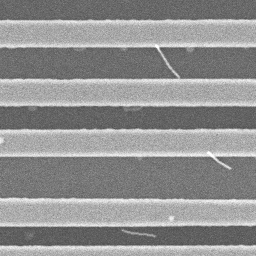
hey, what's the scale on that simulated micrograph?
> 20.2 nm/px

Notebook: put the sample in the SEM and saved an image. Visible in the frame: lines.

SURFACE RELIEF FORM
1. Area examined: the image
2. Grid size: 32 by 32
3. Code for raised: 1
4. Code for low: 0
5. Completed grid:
00000000000000000000000000000000
00000000000000000000000000000000
11000001000101101010111111111111
11111111111111111111111111111111
11111111111111111111111111111111
11111111111111111111111111111111
00000000000000000000000000000000
00000000000000000000000000000000
00000000000000000000000000000000
00000000000000000000000000000000
11111111111111111111111111111111
11111111111111111111111111111111
11111111111111111111111111111111
00000000000000000000000000000000
00000000000000000000000000000000
00000000000000000000000000000000
11111111111111111111111111111111
11111111111111111111111111111111
11111111111111111111111111111111
11111111111111111111111111111111
00000000000000000000000000000000
00000000000000000000000000000000
00000000000000000000000000000000
00000000000000000000000000000000
00000000000000000000000000000000
11111111111111111111111111111111
11111111111111111111111111111111
11111111111111111111111111111111
00000000000000000000000000000000
00000000000000000000000000000000
00000000000000000000000000000000
11111111111111111111111111111111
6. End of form